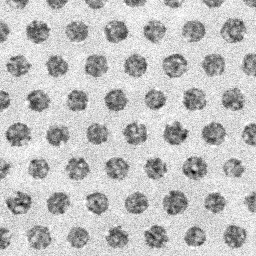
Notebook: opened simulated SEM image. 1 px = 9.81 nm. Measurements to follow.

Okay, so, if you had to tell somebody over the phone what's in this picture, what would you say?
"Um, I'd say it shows a regular array of raised bodies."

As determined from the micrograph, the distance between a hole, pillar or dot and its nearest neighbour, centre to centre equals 382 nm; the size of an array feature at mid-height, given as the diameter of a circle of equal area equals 244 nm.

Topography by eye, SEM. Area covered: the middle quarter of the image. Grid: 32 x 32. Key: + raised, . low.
+....++++++....++++++...+++++++.
+....++++++....++++++....++++++.
......++++......++++.....+++++..
..........................+++...
................................
................................
..++........++.......+++.......+
.+++++....+++++.....+++++.....++
.+++++....++++++....+++++.....++
++++++....++++++....+++++.....++
.+++++....++++++....+++++.....++
..+++......++++.......++.......+
................................
...................++...........
.................+..+......++...
+.....++++.....+++++.....+++++..
+.....+++++....++++++....++++++.
++....+++++....++++++....++++++.
++....+++++....++++++....++++++.
+.....++++.....+++++.....+++++..
.................++........+....
................................
................................
..+++.......+++.......++.......+
.+++++.....+++++....+++++.....++
++++++....++++++....++++++....++
++++++....++++++....++++++....++
.+++++.....+++++....++++++....++
.++++......++++......++++......+
................................
................................
................................